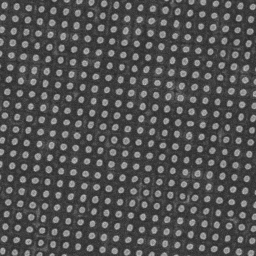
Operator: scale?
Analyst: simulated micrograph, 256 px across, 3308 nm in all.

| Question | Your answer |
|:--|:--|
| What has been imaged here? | a regular array of raised bodies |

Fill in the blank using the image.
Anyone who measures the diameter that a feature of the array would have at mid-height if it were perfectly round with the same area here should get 0.0772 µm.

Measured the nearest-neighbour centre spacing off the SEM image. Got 0.154 µm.